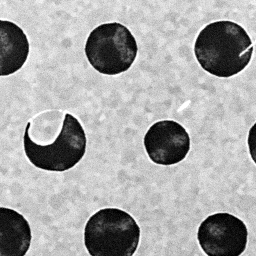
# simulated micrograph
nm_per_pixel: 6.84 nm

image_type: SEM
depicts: holes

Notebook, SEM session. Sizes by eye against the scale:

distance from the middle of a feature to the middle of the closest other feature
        109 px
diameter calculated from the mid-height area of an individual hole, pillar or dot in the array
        53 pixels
